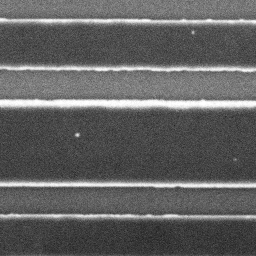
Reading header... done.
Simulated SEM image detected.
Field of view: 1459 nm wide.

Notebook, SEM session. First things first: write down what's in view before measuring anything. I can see lines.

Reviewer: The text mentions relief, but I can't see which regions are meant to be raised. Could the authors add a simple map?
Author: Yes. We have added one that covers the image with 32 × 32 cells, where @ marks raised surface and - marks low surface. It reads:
--------------------------------
--------------------------------
@-------------------------------
@@@@@@@@@@@@@@@@@@@@@@@@@@@@@@@@
@@@@@@@@@@@@@@@@@@@@@@@@@@@@@@@@
@@@@@@@@@@@@@@@@@@@@@@@@@@@@@@@@
@@@@@@@@@@@@@@@@@@@@@@@@@@@@@@@@
@@@@@@@@@@@@@@@@@@@@@@@@@@@@@@@@
@@@@@@@@@@@@@@@@@@@@@@@@@@@@@@@@
--------------------------------
--------------------------------
--------------------------------
--------------------------------
@@@@@@@@@@@@@@@@@@@@@@@@@@@@@@@@
@@@@@@@@@@@@@@@@@@@@@@@@@@@@@@@@
@@@@@@@@@@@@@@@@@@@@@@@@@@@@@@@@
@@@@@@@@@@@@@@@@@@@@@@@@@@@@@@@@
@@@@@@@@@@@@@@@@@@@@@@@@@@@@@@@@
@@@@@@@@@@@@@@@@@@@@@@@@@@@@@@@@
@@@@@@@@@@@@@@@@@@@@@@@@@@@@@@@@
@@@@@@@@@@@@@@@@@@@@@@@@@@@@@@@@
@@@@@@@@@@@@@@@@@@@@@@@@@@@@@@@@
@@@@@@@@@@@@@@@@@@@@@@@@@@@@@@@@
--------------------------------
--------------------------------
--------------------------------
--------------------------------
@@@@@@@@@@@@@@@@@@@@@@@@@@@@@@@@
@@@@@@@@@@@@@@@@@@@@@@@@@@@@@@@@
@@@@@@@@@@@@@@@@@@@@@@@@@@@@@@@@
@@@@@@@@@@@@@@@@@@@@@@@@@@@@@@@@
@@@@@@@@@@@@@@@@@@@@@@@@@@@@@@@@